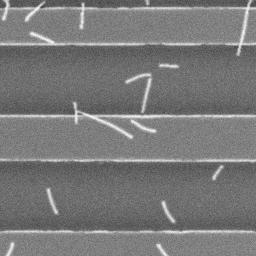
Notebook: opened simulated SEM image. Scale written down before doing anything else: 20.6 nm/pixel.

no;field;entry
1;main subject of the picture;lines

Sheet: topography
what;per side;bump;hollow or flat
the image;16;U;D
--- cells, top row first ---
DDDDDUDDDDDDDDDU
UUUUUUUUUUUUUUUU
UUUUUUUUUUUUUUUU
DDDDDDDDDDDDDDDD
DDDDDDDDDDDDDDDD
DDDDDDDDDDDDDDDD
DDDDDDDDDDDDDDDD
UUUUUUUUUUUUUUUU
UUUUUUUUUUUUUUUU
UUUUUUUUUUUUUUUU
DDDDDDDDDDDDDDDD
DDDDDDDDDDDDDDDD
DDDDDDDDDDDDDDDD
DDDDDDDDDDDDDDDD
UUUUUDUDDUDUUUUU
UUUUUUUUUUUUUUUU